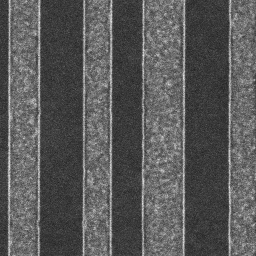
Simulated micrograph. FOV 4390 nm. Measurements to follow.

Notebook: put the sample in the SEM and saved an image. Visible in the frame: one or a few lines or trenches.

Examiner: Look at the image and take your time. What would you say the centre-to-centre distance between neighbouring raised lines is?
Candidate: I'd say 1.25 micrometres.